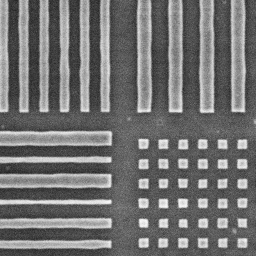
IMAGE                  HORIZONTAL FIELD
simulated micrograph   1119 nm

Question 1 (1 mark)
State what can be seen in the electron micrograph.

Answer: groups of lines, slits or small figures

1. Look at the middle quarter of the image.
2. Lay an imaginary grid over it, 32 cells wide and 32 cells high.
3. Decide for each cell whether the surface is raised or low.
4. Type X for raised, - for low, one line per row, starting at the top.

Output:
X---XX---XX--------XXX-----XX---
X---XX---XX--------XXX-----XX---
X---XX---XX--------XXX-----XX---
X---XX---XX--------XXX----XXX---
X---XX---XX--------XXX----XXX---
X---XX---XX--------XXX----XXX---
X---XX---XX--------XXX----XXX---
X---XX---XX--------XXX----XXX---
X---XX---XX--------XXX-----XX---
X---XX---XX--------XXX-----XX---
X---XX---XX--------XXX-----XX---
X---XX---XX--------XX------XX---
--------------------------------
--------------------------------
--------------------------------
--------------------------------
--------------------------------
XXXXXXXXXXXX--------------------
XXXXXXXXXXXX--------------------
XXXXXXXXXXXX-------XX---XX---XX-
-------------------XX---XX---XX-
--------------------------------
--------------------------------
---XX-XXXX----------------------
-------------------XX---XX---XX-
-------------------XX---XX---XX-
--------------------------------
--------------------------------
XXXXXXXXXXXX--------------------
XXXXXXXXXXXX-------XX---XX---XX-
XXXXXXXXXXXX-------XX---XX---XX-
--------------------------------